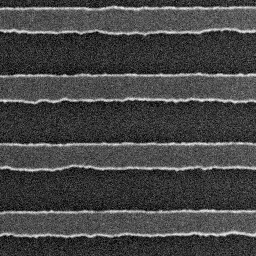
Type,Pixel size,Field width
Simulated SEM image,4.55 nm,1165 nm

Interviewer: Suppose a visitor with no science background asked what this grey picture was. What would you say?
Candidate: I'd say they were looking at lines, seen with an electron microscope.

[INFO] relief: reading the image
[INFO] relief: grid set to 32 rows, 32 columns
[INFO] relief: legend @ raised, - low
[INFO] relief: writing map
--------------------------------
@@@@@@@@@@@@@@@@@@@@@@@@@@@@@@@@
@@@@@@@@@@@@@@@@@@@@@@@@@@@@@@@@
@@@@@@@@@@@@@@@@@@@@@@@@@@@@@@@@
--------------------------------
--------------------------------
--------------------------------
--------------------------------
--------------------------------
-@@@@@@-@@@@@@@@@@@@@@@@@@@@@@@@
@@@@@@@@@@@@@@@@@@@@@@@@@@@@@@@@
@@@@@@@@@@@@@@@@@@@@@@@@@@@@@@@@
@@@@@@@@@@@@@@@@----@@@@-@-@@@@@
--------------------------------
--------------------------------
--------------------------------
--------------------------------
--------------------------------
@@@@@@@@@@@@@@@@@@@@@@@@@@@@@@@@
@@@@@@@@@@@@@@@@@@@@@@@@@@@@@@@@
@@@@@@@@@@@@@@@@@@@@@@@@@@@@@@@@
--------------------------------
--------------------------------
--------------------------------
--------------------------------
--------------------------------
-----@@---@--@@@@@--@@@@@@@@@@@@
@@@@@@@@@@@@@@@@@@@@@@@@@@@@@@@@
@@@@@@@@@@@@@@@@@@@@@@@@@@@@@@@@
---@@--@@--@-@------------------
--------------------------------
--------------------------------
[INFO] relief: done